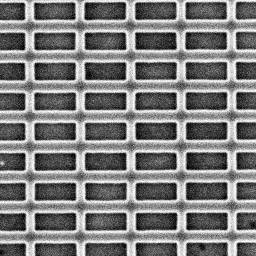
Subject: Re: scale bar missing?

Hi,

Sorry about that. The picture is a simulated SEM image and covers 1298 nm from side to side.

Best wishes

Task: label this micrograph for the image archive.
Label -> groups of lines, slits or small figures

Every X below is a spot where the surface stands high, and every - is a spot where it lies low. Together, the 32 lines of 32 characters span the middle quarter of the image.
---XX-----------XX----------XX--
---XX-----------XX----------XX--
---XX-----------XX----------XX--
---XX-----------XX----------XX--
XXXXXXXXXXXXXXXXXXXXXXXXXXXXXXXX
XXXXXXXXXXXXXXXXXXXXXXXXXXXXXXXX
XXXXXXXXXXXXXXXXXXXXXXXXXXXXXXXX
---XX-----------XX----------XX--
---XX-----------XX----------XX--
---XX-----------XX----------XX--
---XX-----------XX----------XX--
---XXX---------XXX----------XXX-
XXXXXXXXXXXXXXXXXXXXXXXXXXXXXXXX
XXXXXXXXXXXXXXXXXXXXXXXXXXXXXXXX
--XXXX---------XXX----------XXX-
---XX-----------XX----------XX--
---XX-----------XX----------XX--
---XX-----------XX----------XX--
---XX-----------XX----------XX--
XXXXXXXXXXXXXXXXXXXXXXXXXXXXXXXX
XXXXXXXXXXXXXXXXXXXXXXXXXXXXXXXX
XXXXXXXXXXXXXXXXXXXXXXXXXXXXXXXX
---XX-----------XX----------XX--
---XX-----------XX----------XX--
---XX-----------XX----------XX--
---XX-----------XX----------XX--
---XX-----------XX----------XXX-
XXXXXXXXXXXXXXXXXXXXXXXXXXXXXXXX
XXXXXXXXXXXXXXXXXXXXXXXXXXXXXXXX
XXXXXXXXXXXXXXXXXXXXXXXX-XXXXXX-
---XX-----------XX----------XX--
---XX-----------XX----------XX--